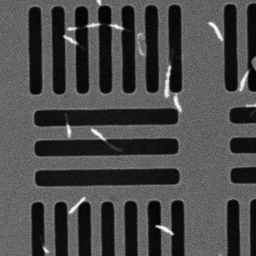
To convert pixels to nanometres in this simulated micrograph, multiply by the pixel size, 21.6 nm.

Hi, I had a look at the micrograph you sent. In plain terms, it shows groups of lines, slits or small figures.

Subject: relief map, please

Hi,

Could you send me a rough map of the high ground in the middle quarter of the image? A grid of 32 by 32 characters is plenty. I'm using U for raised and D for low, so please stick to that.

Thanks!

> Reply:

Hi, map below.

UUUDDDUUUDDDUUUDDDUUDDDDUUUDDUUU
UUUDDDUUUDDDUUUDDDUUDDDDUUUDDDUU
UUUDDDUUUDDDUUUDDDUUDDDDUUDDDDUU
UUUDDDUUUDDDUUUDDDUUDDDDUUDDDDUU
UUUDDDUUUDDDUUUDDDUUDDDDUUDDDDUU
UUUDDDUUUDDDUUUDDDUUDDDDUUDDDDUU
UUUDDDUUUDDDUUUDDDUUUDDUUUDDDUUU
UUUUDUUUUUDUUUUUUUUUUUUUUUUUUUUU
UUUUUUUUUUUUUUUUUUUUUUUUUUUUUUUU
UUUUUUUUUUUUUUUUUUUUUUUUUUUUUUUU
UUUUUUUUUUUUUUUUUUUUUUUUUUUUUUUU
DDDDDDDDDDDDDDDDDDDDDDDDDDDDUUUU
DDDDDDDDDDDDDDDDDDDDDDDDDDDDDUUU
DDDDDDDDDDDDDDDDDDDDDDDDDDDDDUUU
DDDDDDDDDDDDDDDDDDDDDDDDDDDDDUUU
UUDDUUUUUUUUUUUUUUUUUUUUUUUUUUUU
UUUUUUUUUUUUUUUUUUUUUUUUUUUUUUUU
UUUUUUUUUUUUUUUUUUUUUUUUUUUUUUUU
UUUUUUUUUUUUUUUUUUDDDDDDDDDUUUUU
DDDDDDDDDDDDDDDDDDDDDDDDDDDDDUUU
DDDDDDDDDDDDDDDDDDDDDDDDDDDDDUUU
DDDDDDDDDDDDDDDDDDDDDDDDDDDDDUUU
DDDDDDDDDDDDDDDDDDDDDDDDDDDDUUUU
UUUUUUUUUUUUUUUUUUUUUUUUUUUUUUUU
UUUUUUUUUUUUUUUUUUUUUUUUUUUUUUUU
UUUUUUUUUUUUUUUUUUUUUUUUUUUUUUUU
DDDDDDDDDDDDDDDDDDDDDDDDDDDDDUUU
DDDDDDDDDDDDDDDDDDDDDDDDDDDDDUUU
DDDDDDDDDDDDDDDDDDDDDDDDDDDDDUUU
DDDDDDDDDDDDDDDDDDDDDDDDDDDDDUUU
DDDDDDDDDDDDDDDDDUUUUUUUUUUUUUUU
UUUUUUUUUUUUUUUUUUUUUUUUUUUUUUUU